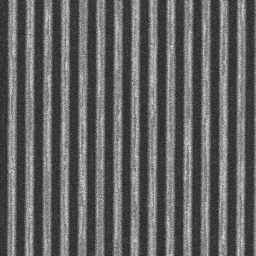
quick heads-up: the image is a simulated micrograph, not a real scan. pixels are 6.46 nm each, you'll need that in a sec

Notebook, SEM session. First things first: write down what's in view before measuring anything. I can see parallel lines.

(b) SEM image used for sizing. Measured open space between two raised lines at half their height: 69.5 nm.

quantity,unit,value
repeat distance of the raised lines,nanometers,114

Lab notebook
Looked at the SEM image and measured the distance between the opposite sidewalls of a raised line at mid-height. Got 46 nm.